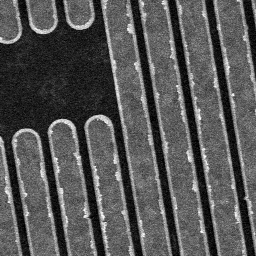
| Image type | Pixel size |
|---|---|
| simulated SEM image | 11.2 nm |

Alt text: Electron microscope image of parallel lines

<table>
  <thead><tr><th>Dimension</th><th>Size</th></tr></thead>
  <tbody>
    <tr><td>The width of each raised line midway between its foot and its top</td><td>0.296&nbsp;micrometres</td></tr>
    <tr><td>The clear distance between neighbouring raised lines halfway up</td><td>0.116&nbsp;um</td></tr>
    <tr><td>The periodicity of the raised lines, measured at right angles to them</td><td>412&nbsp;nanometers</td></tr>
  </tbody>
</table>